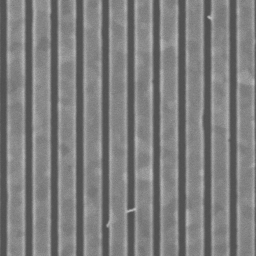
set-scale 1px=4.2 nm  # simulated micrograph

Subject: parallel lines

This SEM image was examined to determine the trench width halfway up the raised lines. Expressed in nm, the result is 33.1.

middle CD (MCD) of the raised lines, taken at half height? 0.0751 microns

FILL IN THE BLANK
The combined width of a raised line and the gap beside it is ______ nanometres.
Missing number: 107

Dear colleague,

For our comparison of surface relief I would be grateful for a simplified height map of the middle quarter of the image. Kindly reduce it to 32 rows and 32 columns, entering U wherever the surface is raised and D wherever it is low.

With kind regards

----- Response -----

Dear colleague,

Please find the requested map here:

UUUDDUUUUDDUUUUUDDUUUUDDUUUUDDDU
UUUDDUUUUDDUUUUUDDUUUUDDUUUUDDDU
UUUDDUUUUDDUUUUUDDUUUUDDUUUUDDDU
UUUDDUUUUDDUUUUUDDUUUUDDUUUUDDDU
UUUDDUUUUDDUUUUUDDUUUUDDUUUUDDDU
UUUDDUUUUDDUUUUUDDUUUUDDUUUUDDDU
UUUDDUUUUDDUUUUUDDUUUUDDUUUUDDDU
UUUDDUUUUDDUUUUUDDUUUUDDUUUUDDDU
UUUDDUUUUDDUUUUUDDUUUUDDUUUUDDDU
UUUDDUUUUDDUUUUUDDUUUUDDUUUUDDDU
UUUDDUUUUDDUUUUUDDUUUUDDUUUUDDDU
UUUDDUUUUDDUUUUUDDUUUUDDUUUUDDDU
UUUDDUUUUDDUUUUUDDUUUUDDUUUUDDDU
UUUDDUUUUDDUUUUUDDUUUUDDUUUUDDDU
UUUDDUUUUDDUUUUUDDUUUUDDUUUUDDDU
UUUDDUUUUDDUUUUUDDUUUUDDUUUUDDDU
UUUDDUUUUDDUUUUUDDUUUUDDUUUUDDDU
UUUDDUUUUDDUUUUUDDUUUUDDUUUUDDDU
UUUDDUUUUDDUUUUUDDUUUUDDUUUUDDDU
UUUDDUUUUDDUUUUUDDUUUUDDUUUUDDDU
UUUDDUUUUDDUUUUUDDUUUUDDUUUUDDDU
UUUDDUUUUDDUUUUUDDUUUUDDUUUUDDDU
UUUDDUUUUDDUUUUUDDUUUUDDUUUUDDDU
UUUDDUUUUDDUUUUUDDUUUUDDUUUUDDDU
UUUDDUUUUDDUUUUUDDUUUUDDUUUUDDDU
UUUDDUUUUDDUUUUUDDUUUUDDUUUUDDDU
UUUDDUUUUDDUUUUUDDUUUUDDUUUUDDDU
UUUDDUUUUDDUUUUUDDUUUUDDUUUUDDDU
UUUDDUUUUDDUUUUUDDUUUUDDUUUUDDDU
UUUDDUUUUDDUUUUUDDUUUUDDUUUUDDDU
UUUDDUUUUDDUUUUUDDUUUUDDUUUUDDDU
UUUDDUUUUDDUUUUUDDUUUUDDUUUUDDDU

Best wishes